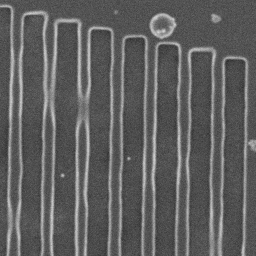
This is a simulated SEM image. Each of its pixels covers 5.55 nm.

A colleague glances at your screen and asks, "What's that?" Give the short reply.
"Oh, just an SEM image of groups of lines, slits or small figures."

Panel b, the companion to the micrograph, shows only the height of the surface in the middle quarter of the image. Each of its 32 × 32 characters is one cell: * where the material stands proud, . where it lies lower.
....**......***......**......**.
....**......***......**......**.
....**......***......**......**.
....**......***......**......***
....**......***.....***......***
....**......***.....***......***
....**......***.....***......**.
....**......***.....***......**.
....**......***.....***......**.
....**......***.....***......**.
....**......***.....***......**.
....**......***.....***......**.
....**......**......***......**.
....**......**......***......**.
....**......**......***......**.
...***......**......***......**.
...***......**......***......**.
...***......**......***......**.
...***......**......***......**.
...***......**......***......**.
...***......**......***......**.
...***......***.....***......**.
...***......***.....***......**.
...***......***.....***......**.
...***......***.....***......**.
...***.....***......***......**.
...***.....***......**.......**.
...***.....***......**.......**.
...***.....***......**.......**.
...***.....***......**......***.
...***.....***......**......***.
...**......***......***.....***.